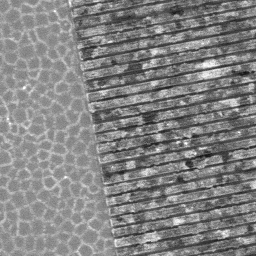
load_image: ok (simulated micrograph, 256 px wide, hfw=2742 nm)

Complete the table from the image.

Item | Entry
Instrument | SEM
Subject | parallel lines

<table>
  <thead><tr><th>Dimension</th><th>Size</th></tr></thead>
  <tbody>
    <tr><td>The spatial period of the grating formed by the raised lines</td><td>10.6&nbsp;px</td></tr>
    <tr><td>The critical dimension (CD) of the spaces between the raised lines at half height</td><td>32.9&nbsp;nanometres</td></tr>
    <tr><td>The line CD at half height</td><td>75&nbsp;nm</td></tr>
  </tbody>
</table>